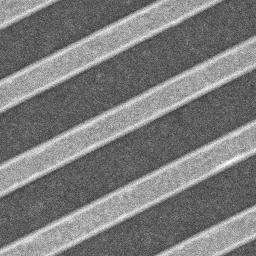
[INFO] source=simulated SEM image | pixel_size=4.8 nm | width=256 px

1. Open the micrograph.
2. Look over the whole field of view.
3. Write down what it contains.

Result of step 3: one or a few lines or trenches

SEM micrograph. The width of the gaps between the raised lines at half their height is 237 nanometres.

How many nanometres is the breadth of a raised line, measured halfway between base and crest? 123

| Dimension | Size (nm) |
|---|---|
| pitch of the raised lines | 362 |